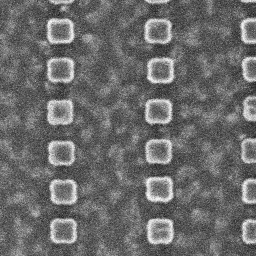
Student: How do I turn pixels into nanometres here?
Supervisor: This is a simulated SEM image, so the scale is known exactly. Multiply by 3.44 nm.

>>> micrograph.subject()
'a regular array of raised bodies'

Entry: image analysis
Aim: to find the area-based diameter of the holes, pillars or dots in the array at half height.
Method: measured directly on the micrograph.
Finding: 90.5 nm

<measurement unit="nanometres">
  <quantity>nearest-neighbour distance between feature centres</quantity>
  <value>134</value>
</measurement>